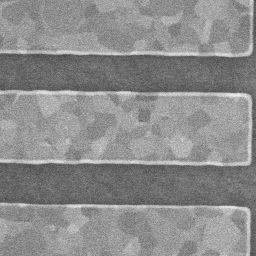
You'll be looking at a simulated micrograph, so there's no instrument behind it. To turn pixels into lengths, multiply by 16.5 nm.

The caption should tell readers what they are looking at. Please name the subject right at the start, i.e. wiring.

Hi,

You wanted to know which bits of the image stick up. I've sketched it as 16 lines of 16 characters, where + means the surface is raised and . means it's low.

++++++++++++++++
++++++++++++++++
++++++++++++++++
................
................
................
++++++++++++++++
++++++++++++++++
++++++++++++++++
++++++++++++++++
................
................
................
+++++++++++++++.
++++++++++++++++
++++++++++++++++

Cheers